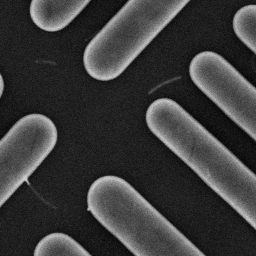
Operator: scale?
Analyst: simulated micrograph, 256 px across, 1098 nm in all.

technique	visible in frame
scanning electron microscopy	groups of lines, slits or small figures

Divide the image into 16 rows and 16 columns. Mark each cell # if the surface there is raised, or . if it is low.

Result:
..###...###....#
..##...###.....#
......###......#
.....###....##..
......##....###.
.............###
..........#...##
.##......###...#
###.......###...
###........###..
##..........###.
#.....##.....###
......###.....##
......####.....#
.......####.....
..###...####....